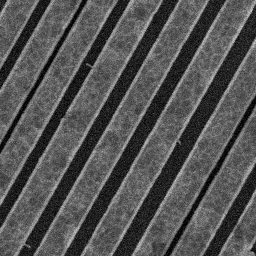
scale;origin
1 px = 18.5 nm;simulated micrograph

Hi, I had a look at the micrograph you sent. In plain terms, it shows parallel lines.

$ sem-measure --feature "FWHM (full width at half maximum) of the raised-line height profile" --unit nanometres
472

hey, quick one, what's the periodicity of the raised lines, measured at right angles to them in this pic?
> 0.735 um